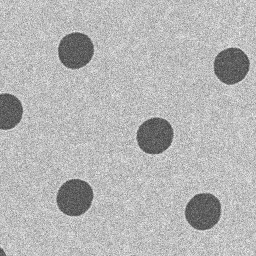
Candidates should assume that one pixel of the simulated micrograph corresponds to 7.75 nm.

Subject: holes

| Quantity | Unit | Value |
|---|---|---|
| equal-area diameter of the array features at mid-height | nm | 287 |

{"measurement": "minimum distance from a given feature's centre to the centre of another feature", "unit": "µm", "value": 0.784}